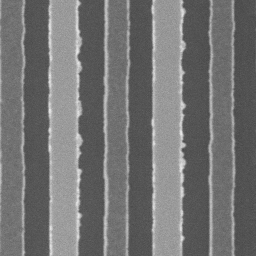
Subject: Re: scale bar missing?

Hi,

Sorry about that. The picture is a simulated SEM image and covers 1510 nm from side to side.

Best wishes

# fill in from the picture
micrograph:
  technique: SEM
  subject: lines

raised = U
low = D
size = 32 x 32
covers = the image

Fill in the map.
UUUDDDUUUUDDDUUUDDDUUUUDDDUUUDDD
UUUDDDUUUUDDDUUUDDDUUUUDDDUUUDDD
UUUDDDUUUUDDDUUUDDDUUUUDDDUUUDDD
UUUDDDUUUUDDDUUUDDDUUUUDDDUUUDDD
UUUDDDUUUUDDDUUUDDDUUUUDDDUUUDDD
UUUDDDUUUUDDDUUUDDDUUUUDDDUUUDDD
UUUDDDUUUUDDDUUUDDDUUUUDDDUUUDDD
UUUDDDUUUUDDDUUUDDDUUUUDDDUUUDDD
UUUDDDUUUUDDDUUUDDDUUUUDDDUUUDDD
UUUDDDUUUUDDDUUUDDDUUUUDDDUUUDDD
UUUDDDUUUUDDDUUUDDDUUUUDDDUUUDDD
UUUDDDUUUUDDDUUUDDDUUUUDDDUUUDDD
UUUDDDUUUUDDDUUUDDDUUUUDDDUUUDDD
UUUDDDUUUUDDDUUUDDDUUUUDDDUUUDDD
UUUDDDUUUUDDDUUUDDDUUUUDDDUUUDDD
UUUDDDUUUUDDDUUUDDDUUUUDDDUUUDDD
UUUDDDUUUUDDDUUUDDDUUUUDDDUUUDDD
UUUDDDUUUUDDDUUUDDDUUUUDDDUUUDDD
UUUDDDUUUUDDDUUUDDDUUUUDDDUUUDDD
UUUDDDUUUUDDDUUUDDDUUUUDDDUUUDDD
UUUDDDUUUUDDDUUUDDDUUUUDDDUUUDDD
UUUDDDUUUUDDDUUUDDDUUUUDDDUUUDDD
UUUDDDUUUUDDDUUUDDDUUUUDDDUUUDDD
UUUDDDUUUUDDDUUUDDDUUUUDDDUUUDDD
UUUDDDUUUUDDDUUUDDDUUUUDDDUUUDDD
UUUDDDUUUUDDDUUUDDDUUUUDDDUUUDDD
UUUDDDUUUUDDDUUUDDDUUUUDDDUUUDDD
UUUDDDUUUUDDDUUUDDDUUUUDDDUUUDDD
UUUDDDUUUUDDDUUUDDDUUUUDDDUUUDDD
UUUDDDUUUUDDDUUUDDDUUUUDDDUUUDDD
UUUDDDUUUUDDDUUUDDDUUUUDDDUUUDDD
UUUDDDUUUUDDDUUUDDDUUUUDDDUUUDDD